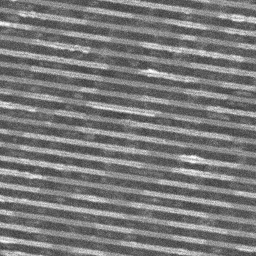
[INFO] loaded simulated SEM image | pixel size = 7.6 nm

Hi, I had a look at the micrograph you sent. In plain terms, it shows parallel lines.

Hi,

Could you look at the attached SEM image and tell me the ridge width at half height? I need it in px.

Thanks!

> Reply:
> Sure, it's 4.33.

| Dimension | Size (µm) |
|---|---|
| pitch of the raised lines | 0.101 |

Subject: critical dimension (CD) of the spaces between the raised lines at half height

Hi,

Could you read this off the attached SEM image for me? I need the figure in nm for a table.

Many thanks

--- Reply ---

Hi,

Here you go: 71.4